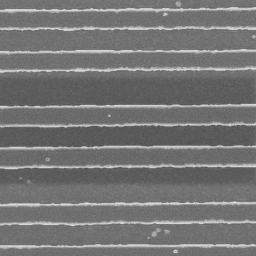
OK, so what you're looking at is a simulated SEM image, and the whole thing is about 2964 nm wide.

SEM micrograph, lines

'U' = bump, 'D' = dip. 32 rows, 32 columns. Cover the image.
DDDDDDDDDDDDDDDDDDDDDDDDDDDDDDDD
UUUUUUUUUUUUUUUUUUUUUUUUUUUUUUUU
UUUUUUUUUUUUUUUUUUUUUUUUUUUUUUUU
UUUUUUUUUUUUUUUUUUUUUUUUUUUUUUUU
DDDDDDDDDDDDDDDDDDDDDDDDDDDDDDDD
DDDDDDDDDDDDDDDDDDDDDDDDDDDDDDDD
DDDDDDDUUUUUUUUUUUUUUUUUUUUUUUUU
UUUUUUUUUUUUUUUUUUUUUUUUUUUUUUUU
UUUUUUUUUUUUUUUUUUUUUUUUUUUUUUUU
DDDDDDDDDDDDDDDDDDDDDDDDDDDDDDDD
DDDDDDDDDDDDDDDDDDDDDDDDDDDDDDDD
DDDDDDDDDDDDDDDDDDDDDDDDDDDDDDDD
DDDDDDDDDDDDDDDDDDDDDDDDDDDDDDDD
UUUUUUUUUUUUUUUUUUUUUUUUUUUUUUUU
UUUUUUUUUUUUUUUUUUUUUUUUUUUUUUUU
UUUUUUUUUUUUUUUUUUUUUUUUUUUUUUUU
DDDDDDDDDDDDDDDDDDDDDDDDDDDDDDDD
DDDDDDDDDDDDDDDDDDDDDDDDDDDDDDDD
DDDDDDDDDDUDUUUUUUUUUUUUUUUUUUUU
UUUUUUUUUUUUUUUUUUUUUUUUUUUUUUUU
UUUUUUUUUUUUUUUUUUUUUUUUUUUUUUUU
DDDDDDDDDDDDDDDDDDDDDDDDDDDDDDDD
DDDDDDDDDDDDDDDDDDDDDDDDDDDDDDDD
DDDDDDDDDDDDDDDDDDDDDDDDDDDDDDDD
DDDDDDDDDDDDDDDDDDDDDDDDDDDDDDDD
DDDDDDDDDDUUUUUUUUUUUUUUUUUUUUUU
UUUUUUUUUUUUUUUUUUUUUUUUUUUUUUUU
UUUUUUUUUUUUUUUUUUUUUUUUUUUUUUUU
DDDDDDDDDDDDDDDDDDDDDDDDDDDDDDDD
DDDDDDDDDDDDDDDDDDDDDDDDDDDDDDDD
DDDDDDDDDDDDDDDDDDDDDDDDDDDDDDDD
UUUUUUUUUUUUUUUUUUUUUUUUUUUUUUUU